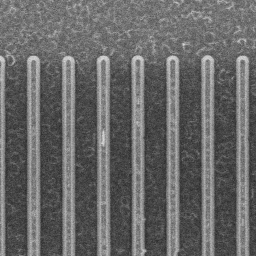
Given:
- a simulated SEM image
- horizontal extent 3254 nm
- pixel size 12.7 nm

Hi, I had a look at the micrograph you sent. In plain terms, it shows parallel lines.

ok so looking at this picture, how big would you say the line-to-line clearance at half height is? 318 nanometers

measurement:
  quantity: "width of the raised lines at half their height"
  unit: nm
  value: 118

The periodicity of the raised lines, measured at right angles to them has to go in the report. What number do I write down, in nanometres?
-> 442